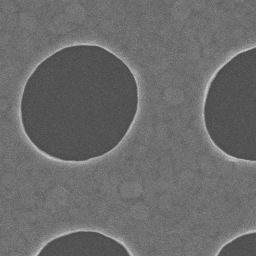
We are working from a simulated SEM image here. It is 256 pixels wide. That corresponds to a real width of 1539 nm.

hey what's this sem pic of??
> holes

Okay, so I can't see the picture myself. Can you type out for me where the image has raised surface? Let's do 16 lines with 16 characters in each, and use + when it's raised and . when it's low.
++++++++++++++++
++++++++++++++++
++++++++++++++++
+++....++++++++.
++......++++++..
++.......++++...
+........++++...
+.......+++++...
++......+++++...
+++....+++++++..
++++++++++++++++
++++++++++++++++
++++++++++++++++
++++++++++++++++
+++++.++++++++++
+++.....++++++..